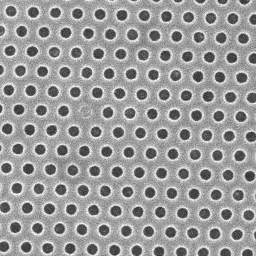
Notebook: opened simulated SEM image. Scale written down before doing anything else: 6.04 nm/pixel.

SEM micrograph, a regular array of holes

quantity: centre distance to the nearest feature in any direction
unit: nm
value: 133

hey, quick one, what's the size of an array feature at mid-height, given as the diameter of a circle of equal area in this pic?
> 69.8 nanometres